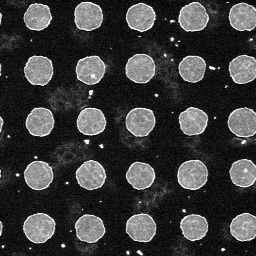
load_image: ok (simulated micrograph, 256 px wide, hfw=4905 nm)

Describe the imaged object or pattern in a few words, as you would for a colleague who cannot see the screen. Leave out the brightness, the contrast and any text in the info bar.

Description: a regular array of raised bodies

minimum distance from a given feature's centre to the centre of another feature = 50.9 px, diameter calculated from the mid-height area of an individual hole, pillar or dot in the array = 0.546 micrometres